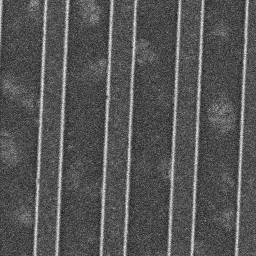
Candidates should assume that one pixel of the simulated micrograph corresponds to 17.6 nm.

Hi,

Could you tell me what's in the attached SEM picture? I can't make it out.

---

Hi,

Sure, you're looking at one or a few lines or trenches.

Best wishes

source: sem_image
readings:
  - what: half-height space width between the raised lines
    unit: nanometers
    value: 782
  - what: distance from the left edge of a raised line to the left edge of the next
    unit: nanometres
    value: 1180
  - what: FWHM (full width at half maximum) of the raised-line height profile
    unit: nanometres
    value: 401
